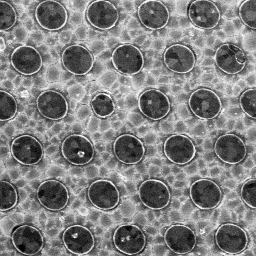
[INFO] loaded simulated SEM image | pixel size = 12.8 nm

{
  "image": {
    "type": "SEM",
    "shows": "a regular array of raised bodies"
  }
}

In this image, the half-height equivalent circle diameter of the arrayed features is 0.382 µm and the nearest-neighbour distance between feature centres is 648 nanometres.